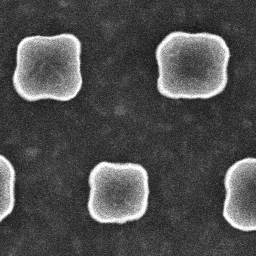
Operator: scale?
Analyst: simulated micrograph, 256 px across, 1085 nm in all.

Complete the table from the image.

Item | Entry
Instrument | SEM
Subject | raised bodies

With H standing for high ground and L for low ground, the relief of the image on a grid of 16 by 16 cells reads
LLLLLLLLLLLLLLLL
LLLLLLLLLLLLLLLL
LLHHHLLLLLHHHHLL
LHHHHLLLLLHHHHLL
LHHHHLLLLLHHHHLL
LHHHHLLLLLHHHHLL
LLLLLLLLLLLLLLLL
LLLLLLLLLLLLLLLL
LLLLLLLLLLLLLLLL
LLLLLLLLLLLLLLLL
HLLLLLHHHLLLLLLH
HLLLLLHHHLLLLLHH
HLLLLLHHHLLLLLHH
LLLLLLHHHLLLLLHH
LLLLLLLLLLLLLLLL
LLLLLLLLLLLLLLLL